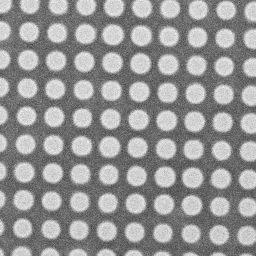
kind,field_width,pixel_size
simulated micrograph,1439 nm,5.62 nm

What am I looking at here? an array of small figures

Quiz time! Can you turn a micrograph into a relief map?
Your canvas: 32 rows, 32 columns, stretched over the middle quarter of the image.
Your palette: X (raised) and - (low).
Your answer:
---XXXX---XXXX---XXXX---XXXX---X
----XX-----XXX---XXXX---XXXX---X
--------------------------------
--------------------------------
----XX--------------------------
---XXXX---XXXX---XXXX---XXX-----
---XXXX---XXXX---XXXX---XXXX---X
---XXXX---XXXX---XXXX---XXXX---X
----XX----XXX----XXX----XXXX---X
-------------------------X------
--------------------------------
----XX-----XX-------------------
---XXXX---XXXX---XXXX---XXX----X
---XXXX--XXXXX--XXXXX--XXXXX--XX
---XXXX--XXXXX--XXXXX--XXXXX--XX
----XX----XXX----XXX----XXXX---X
--------------------------------
--------------------------------
----X------X--------------------
--XXXX---XXXX---XXXX----XXX----X
--XXXXX--XXXXX--XXXXX--XXXXX--XX
--XXXX---XXXXX--XXXXX--XXXXX--XX
---XX-----XXX----XXX----XXXX--XX
-------------------------X-----X
--------------------------------
---XX---------------------------
--XXXX---XXXX---XXXX----XXX----X
--XXXX---XXXX---XXXX---XXXXX--XX
--XXXX---XXXX---XXXX---XXXXX--XX
---XX-----XXX---XXXX---XXXX---XX
-------------------------X-----X
--------------------------------